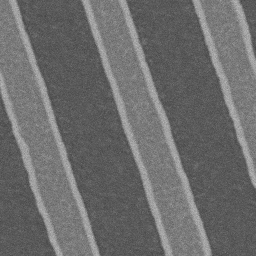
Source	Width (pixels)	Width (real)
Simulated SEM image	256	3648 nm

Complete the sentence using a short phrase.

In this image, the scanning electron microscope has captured one or a few lines or trenches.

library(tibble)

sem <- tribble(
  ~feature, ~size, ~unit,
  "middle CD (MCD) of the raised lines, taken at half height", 524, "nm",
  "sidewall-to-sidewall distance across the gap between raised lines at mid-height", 0.975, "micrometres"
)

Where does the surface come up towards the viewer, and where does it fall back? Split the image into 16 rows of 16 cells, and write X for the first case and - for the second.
X-----XX----XXX-
X-----XX-----XX-
XX----XX-----XX-
XX----XXX----XXX
XX-----XX-----XX
XXX----XX-----XX
XXX----XXX----XX
-XX-----XX-----X
-XXX----XXX----X
--XX----XXX----X
--XX-----XX-----
--XXX----XXX----
--XXX----XXX----
---XX-----XX----
---XXX----XXX---
----XX----XXX---